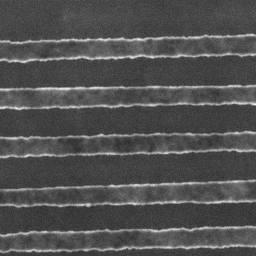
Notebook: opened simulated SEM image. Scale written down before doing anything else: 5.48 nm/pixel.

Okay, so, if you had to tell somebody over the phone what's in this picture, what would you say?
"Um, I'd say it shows lines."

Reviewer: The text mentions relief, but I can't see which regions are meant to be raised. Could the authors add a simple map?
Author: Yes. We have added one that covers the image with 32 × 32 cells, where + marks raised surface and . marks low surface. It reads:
................................
................................
................................
................................
.............................+++
++++++++++++++++++++++++++++++++
++++++++++++++++++++++++++++++++
++++++..........................
................................
................................
................................
++++++++++++++++++++++++++++++++
++++++++++++++++++++++++++++++++
++++++...+......................
................................
................................
..............................++
++++++++++++++++++++++++++++++++
++++++++++++++++++++++++++++++++
++++............................
................................
................................
................................
.......+++++++++++++++++++++++++
++++++++++++++++++++++++++++++++
++++++++++++++++++..............
................................
................................
.........................+++++++
++++++++++++++++++++++++++++++++
++++++++++++++++++++++++++++++++
+...............................